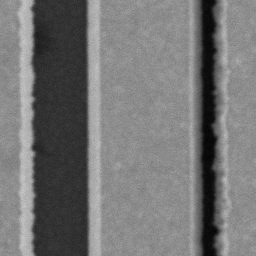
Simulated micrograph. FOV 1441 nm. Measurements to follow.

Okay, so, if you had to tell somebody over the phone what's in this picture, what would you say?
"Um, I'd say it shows one or a few lines or trenches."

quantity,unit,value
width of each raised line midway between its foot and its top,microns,0.57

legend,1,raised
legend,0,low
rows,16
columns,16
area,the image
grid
1100001111110011
1100001111110011
1100001111110011
1100001111110011
1100001111110011
1100001111110011
1100001111110011
1100001111110011
1100001111110011
1100001111110011
1100001111110011
1100001111110011
1100001111110011
1100001111110011
1100001111110011
1100001111110011